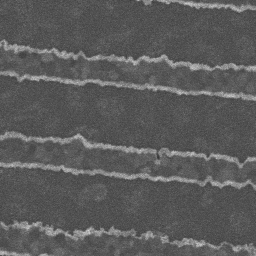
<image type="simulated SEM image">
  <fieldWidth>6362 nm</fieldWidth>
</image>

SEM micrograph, one or a few lines or trenches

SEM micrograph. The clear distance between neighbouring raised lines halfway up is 1.51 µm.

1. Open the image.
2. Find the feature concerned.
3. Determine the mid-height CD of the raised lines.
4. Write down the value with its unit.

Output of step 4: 0.69 µm